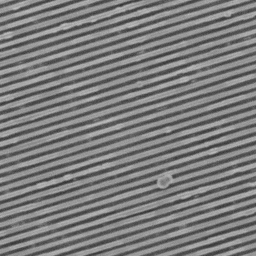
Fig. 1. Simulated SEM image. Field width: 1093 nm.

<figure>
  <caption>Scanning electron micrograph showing parallel lines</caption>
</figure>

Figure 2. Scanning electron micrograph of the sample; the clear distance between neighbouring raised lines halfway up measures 19.4 nanometers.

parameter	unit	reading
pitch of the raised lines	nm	36.4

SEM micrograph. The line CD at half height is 18.9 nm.